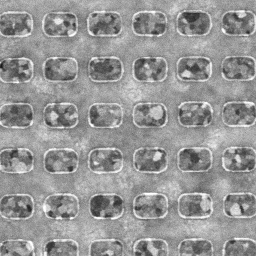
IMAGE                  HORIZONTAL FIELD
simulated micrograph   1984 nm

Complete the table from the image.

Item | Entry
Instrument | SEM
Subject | a regular array of raised bodies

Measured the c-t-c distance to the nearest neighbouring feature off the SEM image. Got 345 nanometres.